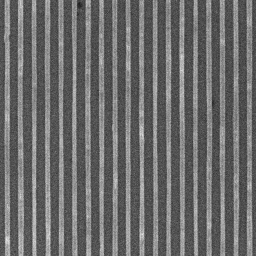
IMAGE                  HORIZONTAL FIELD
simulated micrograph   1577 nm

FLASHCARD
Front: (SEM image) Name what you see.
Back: parallel lines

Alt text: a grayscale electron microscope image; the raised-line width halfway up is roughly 0.0285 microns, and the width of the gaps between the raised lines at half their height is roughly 57.7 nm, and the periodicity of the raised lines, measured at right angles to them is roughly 82.8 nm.